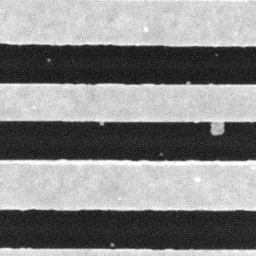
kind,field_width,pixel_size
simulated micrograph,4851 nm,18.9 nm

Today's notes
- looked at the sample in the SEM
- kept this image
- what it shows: lines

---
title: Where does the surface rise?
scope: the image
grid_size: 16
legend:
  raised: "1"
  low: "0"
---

1111111111111111
1111111111111111
1111111111111111
0000000000000000
0000000000000000
1111111111111111
1111111111111111
1111111111111111
0000000000000000
0000000000000000
1111111111111111
1111111111111111
1111111111111111
0000000000000000
0000000000000000
0000000000000000